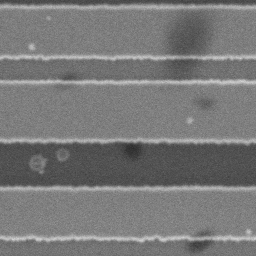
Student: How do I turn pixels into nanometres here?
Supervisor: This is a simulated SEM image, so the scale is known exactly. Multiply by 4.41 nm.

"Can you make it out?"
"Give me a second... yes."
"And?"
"lines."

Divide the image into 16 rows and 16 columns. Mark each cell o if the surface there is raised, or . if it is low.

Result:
oooooooooooooooo
oooooooooooooooo
oooooooooooooooo
oooooooooooooooo
oooooooooooooooo
oooooooooooooooo
oooooooooooooooo
oooooooooooooooo
oooooooooooooooo
................
................
................
oooooooooooooooo
oooooooooooooooo
oooooooooooooooo
oooooooooooooooo